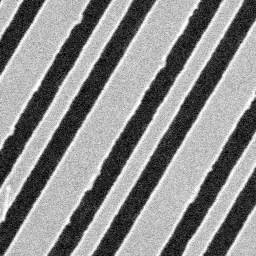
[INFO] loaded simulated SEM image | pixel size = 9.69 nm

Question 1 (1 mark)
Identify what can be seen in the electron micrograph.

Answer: lines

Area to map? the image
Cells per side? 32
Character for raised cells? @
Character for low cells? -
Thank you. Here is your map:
@@@--@@@@@@---@@---@@@@@@---@@--
@@---@@@@@---@@@---@@@@@---@@@--
@---@@@@@@---@@---@@@@@---@@@---
@---@@@@@---@@@---@@@@@---@@---@
---@@@@@---@@@---@@@@@---@@@---@
--@@@@@@---@@---@@@@@@---@@---@@
--@@@@@---@@@---@@@@@---@@@---@@
-@@@@@@---@@---@@@@@@---@@---@@@
-@@@@@---@@@---@@@@@---@@---@@@@
@@@@@---@@@---@@@@@---@@@---@@@@
@@@@@---@@---@@@@@@---@@---@@@@@
@@@@---@@@---@@@@@---@@@---@@@@@
@@@@---@@---@@@@@@---@@---@@@@@@
@@@---@@@---@@@@@---@@---@@@@@@-
@@----@@---@@@@@---@@@---@@@@@--
@@---@@---@@@@@@---@@---@@@@@@--
@@--@@@---@@@@@---@@@---@@@@@---
@---@@---@@@@@@---@@---@@@@@---@
---@@@---@@@@@---@@---@@@@@@---@
---@@---@@@@@---@@@---@@@@@---@@
--@@---@@@@@@---@@---@@@@@@---@@
-@@@---@@@@@---@@@---@@@@@---@@@
-@@---@@@@@@---@@---@@@@@---@@@-
@@@---@@@@@---@@@--@@@@@@---@@--
@@---@@@@@---@@@---@@@@@@--@@@--
@---@@@@@@---@@---@@@@@@---@@---
@---@@@@@---@@@---@@@@@---@@@---
---@@@@@@---@@---@@@@@---@@@---@
---@@@@@---@@@--@@@@@@---@@---@@
--@@@@@---@@@---@@@@@---@@@---@@
-@@@@@@---@@---@@@@@@--@@@---@@@
-@@@@@---@@@---@@@@@---@@@--@@@@